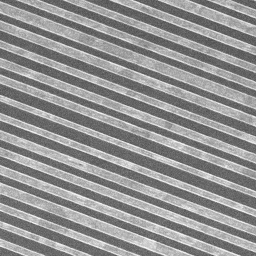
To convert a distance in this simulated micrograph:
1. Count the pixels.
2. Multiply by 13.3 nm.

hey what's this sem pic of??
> parallel lines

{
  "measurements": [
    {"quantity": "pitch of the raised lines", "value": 225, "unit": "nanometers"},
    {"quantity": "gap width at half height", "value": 9.71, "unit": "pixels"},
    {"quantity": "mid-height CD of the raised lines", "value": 0.0968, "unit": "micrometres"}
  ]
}